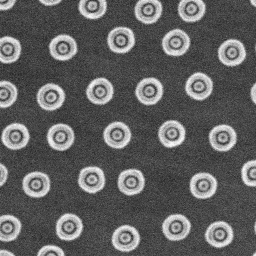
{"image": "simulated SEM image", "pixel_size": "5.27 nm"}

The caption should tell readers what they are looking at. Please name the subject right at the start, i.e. a regular array of ring-shaped raised bodies with a dot in the middle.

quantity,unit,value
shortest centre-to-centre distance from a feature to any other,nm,251